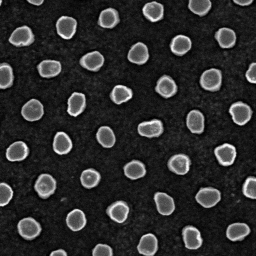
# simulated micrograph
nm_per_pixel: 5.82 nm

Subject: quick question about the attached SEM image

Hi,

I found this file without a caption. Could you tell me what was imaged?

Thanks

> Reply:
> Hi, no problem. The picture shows a regular array of raised bodies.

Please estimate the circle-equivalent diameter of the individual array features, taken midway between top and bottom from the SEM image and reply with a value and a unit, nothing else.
119 nm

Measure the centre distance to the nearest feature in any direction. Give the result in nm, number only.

253